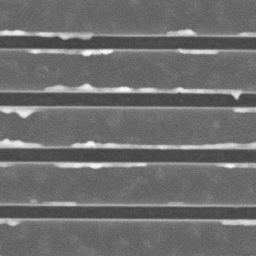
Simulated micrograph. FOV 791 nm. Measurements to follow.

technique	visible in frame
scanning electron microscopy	parallel lines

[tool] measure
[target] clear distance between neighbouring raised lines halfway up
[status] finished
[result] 43.7 nanometres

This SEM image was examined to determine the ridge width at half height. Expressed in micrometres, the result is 0.132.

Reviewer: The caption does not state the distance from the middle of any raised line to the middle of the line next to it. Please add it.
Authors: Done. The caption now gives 56.7 pixels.